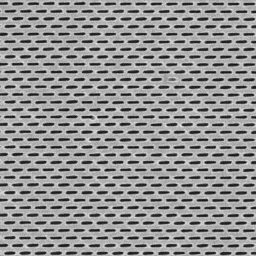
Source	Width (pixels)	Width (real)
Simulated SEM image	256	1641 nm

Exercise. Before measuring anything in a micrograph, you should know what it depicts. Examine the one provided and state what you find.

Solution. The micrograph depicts a regular array of holes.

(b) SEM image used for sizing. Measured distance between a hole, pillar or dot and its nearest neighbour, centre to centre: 66.4 nanometres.